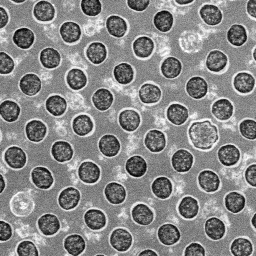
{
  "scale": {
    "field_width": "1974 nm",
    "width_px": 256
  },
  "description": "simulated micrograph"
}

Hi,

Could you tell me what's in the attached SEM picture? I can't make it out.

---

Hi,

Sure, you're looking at a regular array of holes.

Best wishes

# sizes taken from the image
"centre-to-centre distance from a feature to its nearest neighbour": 253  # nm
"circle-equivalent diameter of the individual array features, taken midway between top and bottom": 170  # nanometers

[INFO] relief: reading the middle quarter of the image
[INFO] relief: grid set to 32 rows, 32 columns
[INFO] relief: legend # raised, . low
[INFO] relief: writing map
#############....#######.....###
#...#########.....######.....###
#....#######......#######....###
......#######....#########..####
#.....#######....##############.
#....##############....#######..
##..#####..########.....#######.
#######.....#######.....#######.
#######.....#######.....########
.######.....########...#########
.#######....##############....##
.########.#####...########.....#
##############.....######......#
###....#######.....#######.....#
##.....#######.....########...##
##.....#######.....#############
##.....########...####.########.
###...###############....######.
#########....#######.....######.
.########.....######.....#######
..#######.....######.....#######
..#######.....#######....####.##
..########...###############....
..##############....#######.....
#####..#########....#######.....
####....#######......######.....
###......#######.....#######...#
###......#######....############
####.....##############...######
#####...####.#########.....#####
###########....#######.....#####
...#######.....#######.....#####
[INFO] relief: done